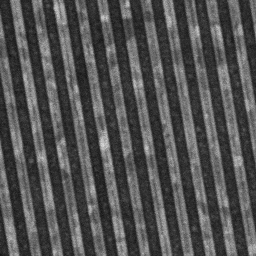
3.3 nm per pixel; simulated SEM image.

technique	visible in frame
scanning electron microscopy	parallel lines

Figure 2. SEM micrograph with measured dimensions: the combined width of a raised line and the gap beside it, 0.0708 µm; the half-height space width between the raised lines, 45.1 nanometers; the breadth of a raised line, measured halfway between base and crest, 0.0256 um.